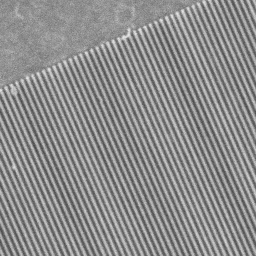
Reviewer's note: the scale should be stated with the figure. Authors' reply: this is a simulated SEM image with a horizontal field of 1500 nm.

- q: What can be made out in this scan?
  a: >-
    parallel lines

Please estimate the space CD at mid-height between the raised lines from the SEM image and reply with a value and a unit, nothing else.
20.1 nm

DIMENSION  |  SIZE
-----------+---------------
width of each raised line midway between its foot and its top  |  14.8 nanometers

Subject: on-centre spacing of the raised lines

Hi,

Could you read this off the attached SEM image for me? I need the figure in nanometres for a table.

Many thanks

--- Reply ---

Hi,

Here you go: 34.1